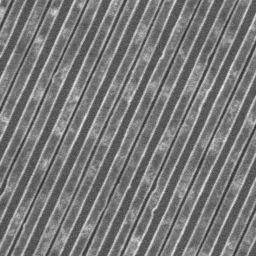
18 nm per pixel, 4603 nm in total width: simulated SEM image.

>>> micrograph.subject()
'parallel lines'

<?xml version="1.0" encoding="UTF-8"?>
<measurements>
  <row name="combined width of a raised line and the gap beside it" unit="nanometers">306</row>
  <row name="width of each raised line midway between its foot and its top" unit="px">10.8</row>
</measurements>